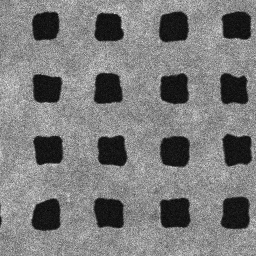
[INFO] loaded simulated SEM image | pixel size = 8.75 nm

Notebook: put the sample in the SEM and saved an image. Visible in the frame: a regular array of holes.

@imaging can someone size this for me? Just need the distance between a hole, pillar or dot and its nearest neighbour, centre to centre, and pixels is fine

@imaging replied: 61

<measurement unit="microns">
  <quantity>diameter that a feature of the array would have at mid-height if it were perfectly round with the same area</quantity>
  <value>0.273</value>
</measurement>